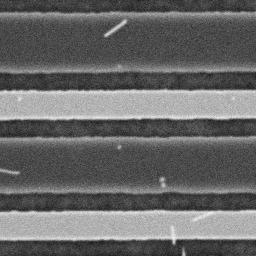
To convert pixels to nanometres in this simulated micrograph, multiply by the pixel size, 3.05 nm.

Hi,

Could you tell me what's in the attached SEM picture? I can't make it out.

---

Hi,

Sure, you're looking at lines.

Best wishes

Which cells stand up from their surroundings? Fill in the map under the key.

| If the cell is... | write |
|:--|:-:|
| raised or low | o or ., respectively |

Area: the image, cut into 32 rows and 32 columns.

................................
................................
oooooooooooooooooooooooooooooooo
oooooooooooooooooooooooooooooooo
oooooooooooooooooooooooooooooooo
oooooooooooooooooooooooooooooooo
oooooooooooooooooooooooooooooooo
oooooooooooooooooooooooooooooooo
oooooooooooooooooooooooooooooooo
................................
................................
oooooooooooooooooooooooooooooooo
oooooooooooooooooooooooooooooooo
oooooooooooooooooooooooooooooooo
oooooooooooooooooooooooooooooooo
................................
................................
oooooooooooooooooooooooooooooooo
oooooooooooooooooooooooooooooooo
oooooooooooooooooooooooooooooooo
oooooooooooooooooooooooooooooooo
oooooooooooooooooooooooooooooooo
oooooooooooooooooooooooooooooooo
oooooooooooooooooooooooooooooooo
................................
................................
.oooo.oooooooooooooooooooooooooo
oooooooooooooooooooooooooooooooo
oooooooooooooooooooooooooooooooo
oooooooooooooooooooooooooooooooo
................................
................................